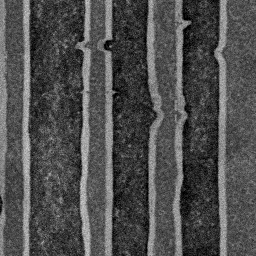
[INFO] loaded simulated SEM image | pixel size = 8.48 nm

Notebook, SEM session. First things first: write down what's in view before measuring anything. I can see one or a few lines or trenches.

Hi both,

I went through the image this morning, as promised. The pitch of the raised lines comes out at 619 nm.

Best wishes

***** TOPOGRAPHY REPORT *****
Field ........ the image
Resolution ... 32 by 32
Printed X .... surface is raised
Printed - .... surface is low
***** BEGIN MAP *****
XXX--------XXX-----XXX------XXXX
XXX--------XXX-----XXX------XXXX
XXX--------XXX-----XXXX-----XXXX
XXX--------XXX-----XXXX-----XXXX
XXX--------XXX-----XXXX-----XXXX
XXX-------XXX------XXXX-----XXXX
XXX--------XX------XXXX----XXXXX
XXX--------XXX-----XXXX----XXXXX
XXX--------XXX-----XXXX-----XXXX
XXX--------XXX-----XXX------XXXX
XXX--------XXX-----XXX------XXXX
XXX--------XXX-----XXX------XXXX
XXX--------XXX------XXX-----XXXX
XXX--------XXX------XXX-----XXXX
XXX--------XXX------XXX-----XXXX
XXX--------XXX------XXX-----XXXX
XXX--------XXX-----XXX------XXXX
XXX--------XXX-----XXX------XXXX
XXX--------XXX-----XXX------XXXX
XXX--------XXX-----XXX------XXXX
XXX--------XXX-----XXXX-----XXXX
XXX--------XXX-----XXXX-----XXXX
XXX-------XXXX-----XXXX-----XXXX
XXX-------XXXX-----XXX------XXXX
XXX-------XXXX-----XXX------XXXX
XXX--------XXX-----XXX------XXXX
XXX-------XXXX-----XXX------XXXX
XXX--------XXX-----XXX------XXXX
XXX--------XXX-----XXX------XXXX
XXX--------XXX-----XXX------XXXX
XXX--------XXX-----XXX------XXXX
XXX--------XXX-----XXX------XXXX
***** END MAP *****